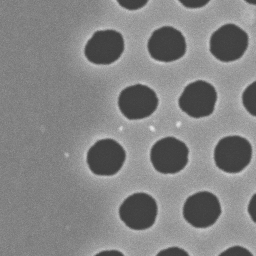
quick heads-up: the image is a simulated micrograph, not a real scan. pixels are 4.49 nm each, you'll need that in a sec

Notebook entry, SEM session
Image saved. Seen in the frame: a regular array of holes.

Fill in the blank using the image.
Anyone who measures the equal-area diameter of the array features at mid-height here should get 172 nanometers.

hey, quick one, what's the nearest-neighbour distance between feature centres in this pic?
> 280 nm